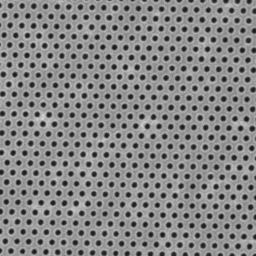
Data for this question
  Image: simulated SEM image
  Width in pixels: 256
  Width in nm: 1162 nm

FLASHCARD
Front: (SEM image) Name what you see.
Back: a regular array of holes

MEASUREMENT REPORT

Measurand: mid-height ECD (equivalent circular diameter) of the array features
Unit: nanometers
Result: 26.1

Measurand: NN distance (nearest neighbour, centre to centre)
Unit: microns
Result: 0.0505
